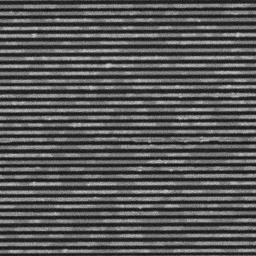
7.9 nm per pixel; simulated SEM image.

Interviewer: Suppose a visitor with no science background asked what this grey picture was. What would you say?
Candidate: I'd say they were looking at parallel lines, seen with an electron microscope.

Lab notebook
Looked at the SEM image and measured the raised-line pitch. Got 58.6 nm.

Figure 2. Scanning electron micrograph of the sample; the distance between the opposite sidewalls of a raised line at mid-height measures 26.7 nm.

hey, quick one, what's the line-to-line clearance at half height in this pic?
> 33.6 nm